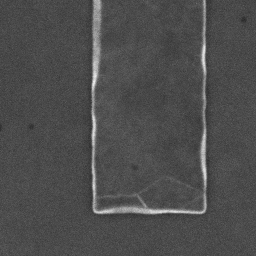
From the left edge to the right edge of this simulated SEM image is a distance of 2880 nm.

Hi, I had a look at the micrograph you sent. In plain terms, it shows wiring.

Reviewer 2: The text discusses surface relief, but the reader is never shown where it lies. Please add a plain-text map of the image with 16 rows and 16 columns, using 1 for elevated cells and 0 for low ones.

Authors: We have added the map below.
0000001111111000
0000001111111000
0000001111111000
0000001111111000
0000001111111000
0000001111111000
0000001111111000
0000001111111000
0000001111111000
0000001111111000
0000001111111000
0000001111111000
0000001111111000
0000000000000000
0000000000000000
0000000000000000